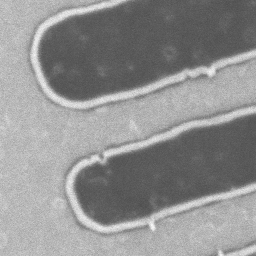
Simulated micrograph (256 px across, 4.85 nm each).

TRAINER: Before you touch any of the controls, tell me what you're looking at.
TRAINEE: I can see one or a few lines or trenches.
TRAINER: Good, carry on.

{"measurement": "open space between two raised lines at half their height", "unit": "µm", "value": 0.247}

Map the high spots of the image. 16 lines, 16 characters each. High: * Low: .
......**********
...*************
..**************
..**************
..***********...
...*******......
....**..........
.............***
..........******
.......*********
.....***********
....************
.....********...
.....*****......
................
................